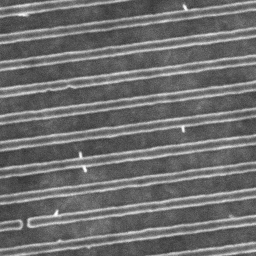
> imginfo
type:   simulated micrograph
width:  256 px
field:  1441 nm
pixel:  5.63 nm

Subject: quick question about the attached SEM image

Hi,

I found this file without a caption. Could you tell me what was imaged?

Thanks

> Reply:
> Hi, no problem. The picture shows parallel lines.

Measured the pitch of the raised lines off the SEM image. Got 0.15 um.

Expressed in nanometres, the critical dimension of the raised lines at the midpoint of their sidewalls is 48.1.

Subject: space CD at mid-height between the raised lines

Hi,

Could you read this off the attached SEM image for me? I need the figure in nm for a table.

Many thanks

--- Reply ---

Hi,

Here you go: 102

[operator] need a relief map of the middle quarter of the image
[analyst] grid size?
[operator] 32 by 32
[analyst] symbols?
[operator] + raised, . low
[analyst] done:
............................++++
....................++++++++++++
............+++++++++++++++.....
.....++++++++++++++++...........
++++++++++++....................
+++++...........................
................................
.........................+++++++
..................++++++++++++++
..........++++++++++++++++......
...+++++++++++++++..............
++++++++++......................
+++.............................
.............................+++
......................++++++++++
...............+++++++++++++++..
.......+++++++++++++++..........
.+++++++++++++..................
+++++++++.......................
+...............................
...........................+++++
....................++++++++++++
............+++++++++++++++++...
....++++++++++++++++++..........
++++++++++++++..................
+++++++.........................
................................
...........................+++++
..................++++++++++++++
...........++++++++++++++.+.....
...+++++++++++++++..............
++++++++++......................